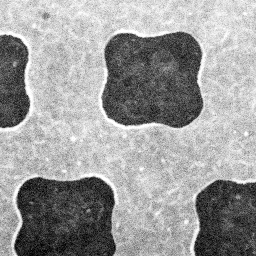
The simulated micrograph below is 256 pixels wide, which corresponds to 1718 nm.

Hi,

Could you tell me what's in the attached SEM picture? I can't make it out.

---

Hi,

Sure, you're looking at holes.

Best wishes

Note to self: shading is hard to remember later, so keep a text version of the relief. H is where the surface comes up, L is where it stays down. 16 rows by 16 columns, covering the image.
HHHHHHHHHHHHHHHH
HHHHHHHHHHHHHHHH
LHHHHHHLLLLLHHHH
LLHHHHHLLLLLLHHH
LLHHHHHLLLLLHHHH
LLHHHHHLLLLLHHHH
LLHHHHLLLLLLLHHH
LHHHHHHLLLLLHHHH
HHHHHHHHHHHHHHHH
HHHHHHHHHHHHHHHH
HHHHHHHHHHHHHHHH
HLLLLLLHHHHHHLLL
HLLLLLLHHHHHLLLL
HLLLLLLHHHHHLLLL
HLLLLLLHHHHHLLLL
HLLLLLLHHHHHLLLL